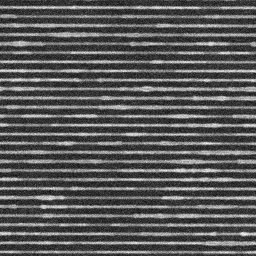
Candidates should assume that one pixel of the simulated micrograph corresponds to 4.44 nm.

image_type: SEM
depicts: parallel lines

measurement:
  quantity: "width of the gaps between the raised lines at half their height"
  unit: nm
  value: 29.4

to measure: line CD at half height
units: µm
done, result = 0.0111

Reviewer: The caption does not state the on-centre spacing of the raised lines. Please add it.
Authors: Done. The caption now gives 9.05 pixels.